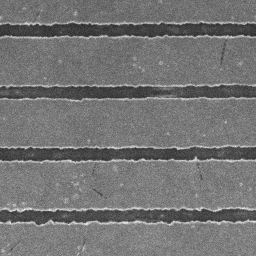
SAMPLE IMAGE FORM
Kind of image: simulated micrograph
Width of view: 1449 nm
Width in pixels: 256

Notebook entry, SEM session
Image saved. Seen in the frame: one or a few lines or trenches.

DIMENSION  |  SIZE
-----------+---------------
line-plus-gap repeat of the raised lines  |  350 nanometres